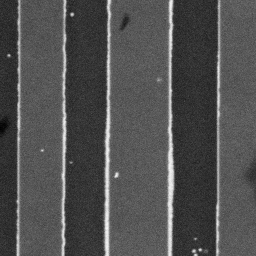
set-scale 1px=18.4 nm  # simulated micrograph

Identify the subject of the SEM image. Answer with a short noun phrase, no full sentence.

lines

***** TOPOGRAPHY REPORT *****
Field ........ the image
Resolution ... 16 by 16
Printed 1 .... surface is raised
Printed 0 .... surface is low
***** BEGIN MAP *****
0111000111100011
0111000111100011
0111000111100011
0111000111100011
0111000111100011
0111000111100011
0111000111100011
0111000111100011
0111000111100011
0111000111100011
0111000111100011
0111000111100011
0111000111100011
0111000111100011
0111000111100011
0111000111100011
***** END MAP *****